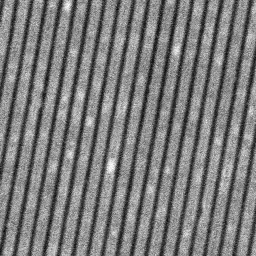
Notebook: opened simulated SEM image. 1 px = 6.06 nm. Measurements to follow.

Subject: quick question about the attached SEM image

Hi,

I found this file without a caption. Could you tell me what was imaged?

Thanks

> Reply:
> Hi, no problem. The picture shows parallel lines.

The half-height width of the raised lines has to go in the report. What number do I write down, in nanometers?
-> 56.6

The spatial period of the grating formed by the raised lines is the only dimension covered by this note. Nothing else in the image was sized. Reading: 87.1 nanometres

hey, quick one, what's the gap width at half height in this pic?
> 0.0306 micrometres